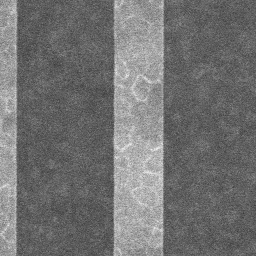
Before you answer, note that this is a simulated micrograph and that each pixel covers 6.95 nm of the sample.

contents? one or a few lines or trenches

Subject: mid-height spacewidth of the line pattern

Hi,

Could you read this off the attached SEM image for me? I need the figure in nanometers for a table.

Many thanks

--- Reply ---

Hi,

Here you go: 683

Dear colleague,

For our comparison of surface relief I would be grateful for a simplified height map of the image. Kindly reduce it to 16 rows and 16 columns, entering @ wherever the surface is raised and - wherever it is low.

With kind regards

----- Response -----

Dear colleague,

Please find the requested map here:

@------@@@------
@------@@@------
@------@@@------
@------@@@------
@------@@@------
@------@@@------
@------@@@------
@------@@@------
@------@@@------
@------@@@------
@------@@@------
@------@@@------
@------@@@------
@------@@@------
@------@@@------
@------@@@------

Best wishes